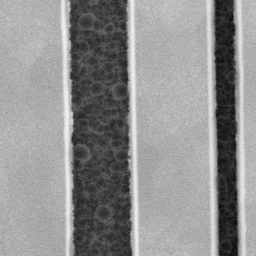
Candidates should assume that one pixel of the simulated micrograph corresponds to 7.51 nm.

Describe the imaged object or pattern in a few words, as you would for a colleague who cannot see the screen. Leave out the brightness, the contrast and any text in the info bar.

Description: one or a few lines or trenches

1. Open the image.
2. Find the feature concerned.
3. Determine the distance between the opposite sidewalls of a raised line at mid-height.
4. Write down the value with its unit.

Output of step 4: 582 nanometers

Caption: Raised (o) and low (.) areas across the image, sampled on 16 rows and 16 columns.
oooo....ooooo..o
oooo....ooooo..o
oooo....ooooo..o
oooo....ooooo..o
oooo....ooooo..o
oooo....ooooo..o
oooo....ooooo..o
oooo....ooooo..o
oooo....ooooo..o
oooo....ooooo..o
oooo....ooooo..o
oooo....ooooo..o
oooo....ooooo..o
oooo....ooooo..o
oooo.....oooo..o
oooo.....oooo..o